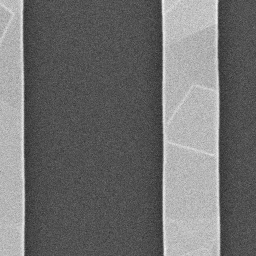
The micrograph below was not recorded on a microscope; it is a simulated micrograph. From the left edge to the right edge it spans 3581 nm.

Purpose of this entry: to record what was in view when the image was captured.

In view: wiring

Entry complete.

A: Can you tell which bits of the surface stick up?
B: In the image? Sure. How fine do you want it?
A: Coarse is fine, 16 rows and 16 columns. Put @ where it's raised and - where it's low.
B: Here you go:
@---------@@@@--
@---------@@@@--
@---------@@@@--
@---------@@@@--
@---------@@@@--
@---------@@@@--
@---------@@@@--
@---------@@@@--
@---------@@@@--
@---------@@@@--
@---------@@@@--
@---------@@@@--
@---------@@@@--
@---------@@@@--
@---------@@@@--
@---------@@@@--